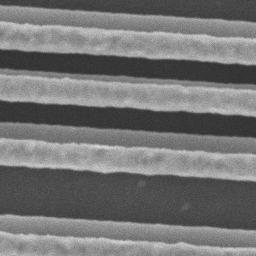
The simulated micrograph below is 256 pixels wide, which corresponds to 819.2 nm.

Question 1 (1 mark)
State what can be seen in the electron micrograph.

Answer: lines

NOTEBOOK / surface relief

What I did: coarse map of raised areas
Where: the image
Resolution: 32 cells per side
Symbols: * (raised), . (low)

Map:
................................
***********.....................
****************************....
********************************
********************************
********************************
.......*************************
........................********
................................
**************..................
*****************************...
********************************
********************************
.................***************
...............................*
****............................
******************..............
********************************
********************************
********************************
********************************
............********************
...............................*
................................
................................
................................
................................
***********.....................
****************************....
********************************
********************************
********************************